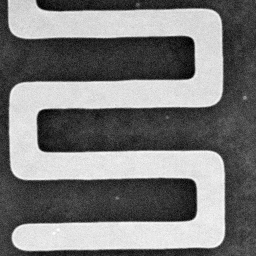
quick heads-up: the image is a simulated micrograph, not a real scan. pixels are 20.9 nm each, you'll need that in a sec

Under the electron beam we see groups of lines, slits or small figures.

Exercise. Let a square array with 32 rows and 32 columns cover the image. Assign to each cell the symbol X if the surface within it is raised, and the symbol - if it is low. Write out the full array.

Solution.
-XXXX---------------------------
-XXXXXX--XXXXXXXXXXXXXXXXXX-----
-XXXXXXXXXXXXXXXXXXXXXXXXXXX----
-XXXXXXXXXXXXXXXXXXXXXXXXXXX----
--XXXXXXXXXXXXXXXXXXX--XXXXX----
------------------------XXXX----
------------------------XXXX----
------------------------XXXX----
------------------------XXXX----
------------------------XXXX----
--XXXXXXXXXXXXXXXXXXXXXXXXXX----
-XXXXXXXXXXXXXXXXXXXXXXXXXXX----
-XXXXXXXXXXXXXXXXXXXXXXXXXX-----
-XXXXX--------------------------
-XXXX---------------------------
-XXXX---------------------------
-XXXX---------------------------
-XXXX---------------------------
-XXXX---------------------------
-XXXXXXXXXXXXXXXXXXXXXXXXXX-----
-XXXXXXXXXXXXXXXXXXXXXXXXXXX----
--XXXXXXXXXXXXXXXXXXXXXXXXXX----
------------------------XXXX----
-------------------------XXX----
-------------------------XXX----
-------------------------XXX----
-------------------------XXX----
------------------------XXXX----
--XXXXXXXXXXXXXXXXXXXXXXXXXX----
--XXXXXXXXXXXXXXXXXXXXXXXXXX----
--XXXXXXXXXXXXXXXXXXXXXXXXX-----
--------------------------------